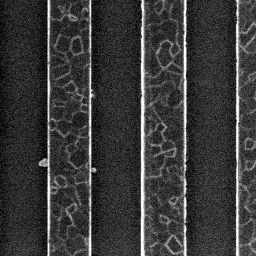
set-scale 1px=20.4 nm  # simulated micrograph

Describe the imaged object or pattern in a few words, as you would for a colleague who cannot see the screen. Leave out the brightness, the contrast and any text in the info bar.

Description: lines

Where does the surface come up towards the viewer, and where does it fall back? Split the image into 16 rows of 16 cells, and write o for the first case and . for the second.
...ooo...ooo...o
...ooo...ooo...o
...ooo...ooo...o
...ooo...ooo...o
...ooo...ooo...o
...ooo...ooo...o
...ooo...ooo...o
...ooo...ooo...o
...ooo...ooo...o
...ooo...ooo...o
...ooo...ooo...o
...ooo...ooo...o
...ooo...ooo...o
...ooo...ooo...o
...ooo...ooo...o
...ooo...ooo...o